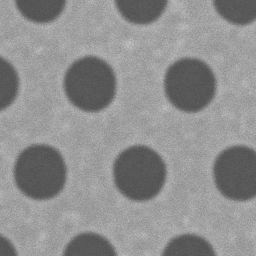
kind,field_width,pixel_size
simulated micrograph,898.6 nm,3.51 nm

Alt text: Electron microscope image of holes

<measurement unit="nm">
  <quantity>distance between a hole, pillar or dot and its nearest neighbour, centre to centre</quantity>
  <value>349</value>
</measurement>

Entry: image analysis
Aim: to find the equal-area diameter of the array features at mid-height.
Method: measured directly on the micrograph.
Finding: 0.195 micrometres